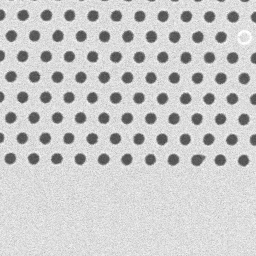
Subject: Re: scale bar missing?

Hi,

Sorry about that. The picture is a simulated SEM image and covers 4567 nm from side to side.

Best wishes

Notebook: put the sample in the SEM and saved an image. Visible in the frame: a regular array of holes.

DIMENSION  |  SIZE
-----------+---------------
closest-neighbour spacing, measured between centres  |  23.2 pixels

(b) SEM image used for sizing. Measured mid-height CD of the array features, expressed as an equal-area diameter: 219 nanometres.